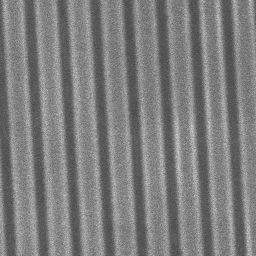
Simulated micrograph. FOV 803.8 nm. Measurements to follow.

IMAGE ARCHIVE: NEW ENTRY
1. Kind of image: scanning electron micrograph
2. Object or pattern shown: parallel lines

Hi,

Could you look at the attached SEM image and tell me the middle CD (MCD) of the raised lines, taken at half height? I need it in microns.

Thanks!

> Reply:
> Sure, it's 0.0628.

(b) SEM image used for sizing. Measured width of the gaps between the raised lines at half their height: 39.6 nanometers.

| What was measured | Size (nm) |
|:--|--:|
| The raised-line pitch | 103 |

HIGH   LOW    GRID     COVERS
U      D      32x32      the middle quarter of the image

DDUUUUUDDDUUUUUDDDDUUUUDDDDUUUUU
DDUUUUUDDDUUUUUDDDDUUUUUDDDUUUUU
DDUUUUUDDDDUUUUDDDDUUUUUDDDUUUUU
DDUUUUUDDDDUUUUDDDDUUUUUDDDUUUUU
DDUUUUUDDDDUUUUDDDDUUUUUDDDUUUUU
DDDUUUUDDDDUUUUDDDDUUUUUDDDUUUUU
DDDUUUUDDDDUUUUUDDDUUUUUDDDUUUUU
DDDUUUUDDDDUUUUUDDDUUUUUDDDUUUUU
DDDUUUUDDDDUUUUUDDDUUUUUDDDUUUUU
DDDUUUUUDDDUUUUUDDDUUUUUDDDUUUUU
DDDUUUUUDDDUUUUUDDDUUUUUDDDUUUUU
DDDUUUUUDDDUUUUUDDDUUUUUDDDUUUUU
DDDUUUUUDDDUUUUUDDDUUUUUDDDUUUUU
DDDUUUUUDDDUUUUUDDDUUUUUDDDUUUUU
DDDUUUUUDDDUUUUUDDDUUUUUDDDDUUUU
DDDUUUUUDDDUUUUUDDDUUUUUDDDDUUUU
DDDUUUUUDDDUUUUUDDDUUUUUDDDDUUUU
DDDUUUUUDDDUUUUUDDDDUUUUDDDDUUUU
DDDUUUUUDDDUUUUUDDDDUUUUDDDDUUUU
DDDUUUUUDDDUUUUUDDDDUUUUDDDDUUUU
DDDUUUUUDDDDUUUUDDDDUUUUDDDDUUUU
DDDUUUUUDDDDUUUUDDDDUUUUUDDDUUUU
DDDDUUUUDDDDUUUUDDDDUUUUUDDDUUUU
DDDUUUUUDDDDUUUUUDDDUUUUUDDDUUUU
DDDDUUUUDDDDUUUUUDDDUUUUUDDDUUUU
DDDDUUUUDDDDUUUUUDDDUUUUUDDDUUUU
DDDDUUUUUDDDUUUUUDDDUUUUUDDDUUUU
DDDDUUUUUDDDUUUUUDDDUUUUUDDDUUUU
DDDDUUUUUDDDUUUUUDDDUUUUUDDDUUUU
UDDDUUUUUDDDUUUUUDDDUUUUUDDDUUUU
UDDDUUUUUDDDUUUUUDDDUUUUUDDDUUUU
UDDDUUUUUDDDUUUUUDDDUUUUUDDDDUUU